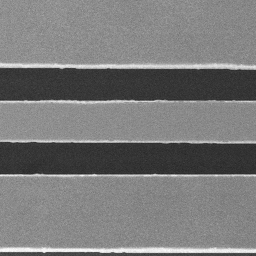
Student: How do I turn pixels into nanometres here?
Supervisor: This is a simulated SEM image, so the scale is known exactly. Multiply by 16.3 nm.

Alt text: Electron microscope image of lines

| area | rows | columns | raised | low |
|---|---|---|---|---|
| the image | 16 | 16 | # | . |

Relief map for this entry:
################
################
################
################
................
................
################
################
################
................
................
################
################
################
################
################